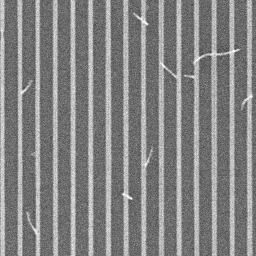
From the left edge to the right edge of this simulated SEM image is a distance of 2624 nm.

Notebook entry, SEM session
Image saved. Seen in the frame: parallel lines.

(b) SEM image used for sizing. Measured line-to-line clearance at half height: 145 nanometers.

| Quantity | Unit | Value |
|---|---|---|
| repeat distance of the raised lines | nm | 181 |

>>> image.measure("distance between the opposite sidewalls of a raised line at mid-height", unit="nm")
37.1